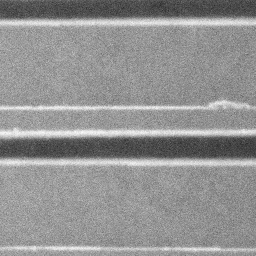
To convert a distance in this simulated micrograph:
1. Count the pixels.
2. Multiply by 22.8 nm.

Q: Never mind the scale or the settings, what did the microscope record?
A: lines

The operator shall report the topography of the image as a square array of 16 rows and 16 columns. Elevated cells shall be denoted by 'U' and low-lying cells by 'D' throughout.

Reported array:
DDDDDDDDDDDDDDDD
DUUDUUUUUUUUUUUU
UUUUUUUUUUUUUUUU
UUUUUUUUUUUUUUUU
UUUUUUUUUUUUUUUU
UUUUUUUUUUUUUUUU
UUUUUUUUUUUUUUUU
UUUUUUUUUUUUUUUU
DDDDDDDDDDDDDDDD
DDDDDDDDDDDDDDDD
UUUUUUUUUUUUUUUU
UUUUUUUUUUUUUUUU
UUUUUUUUUUUUUUUU
UUUUUUUUUUUUUUUU
UUUUUUUUUUUUUUUU
UUUUUUUUUUUUUUUU